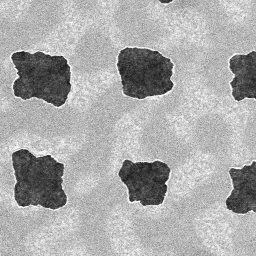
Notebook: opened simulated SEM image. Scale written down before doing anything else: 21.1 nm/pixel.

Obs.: holes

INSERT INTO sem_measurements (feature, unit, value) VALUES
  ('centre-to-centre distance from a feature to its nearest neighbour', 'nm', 2170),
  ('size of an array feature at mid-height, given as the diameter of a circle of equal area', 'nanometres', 1190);